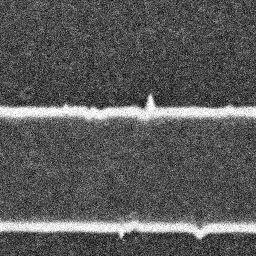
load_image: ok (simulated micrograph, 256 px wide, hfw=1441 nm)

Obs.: one or a few lines or trenches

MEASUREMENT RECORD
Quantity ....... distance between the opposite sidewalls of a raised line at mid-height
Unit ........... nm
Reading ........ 655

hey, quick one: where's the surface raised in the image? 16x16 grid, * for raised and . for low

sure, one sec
................
................
................
................
................
................
................
****************
****************
****************
****************
****************
****************
****************
............*...
................